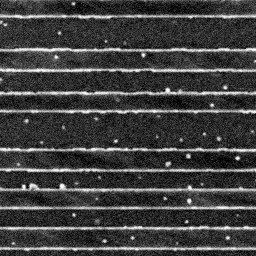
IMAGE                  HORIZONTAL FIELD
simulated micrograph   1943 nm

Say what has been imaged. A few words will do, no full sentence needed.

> lines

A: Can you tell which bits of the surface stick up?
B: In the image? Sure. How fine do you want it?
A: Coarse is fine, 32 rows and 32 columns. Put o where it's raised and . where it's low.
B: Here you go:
oooooooooooooooooooooooooooooooo
oooooooooooooooooooooooooooooooo
................................
................................
................................
................................
oooooooooooooooooooooooooooooooo
oooooooooooooooooooooooooooooooo
oooooooooooooooooooooooooooooooo
................................
................................
....................oo..........
oooooooooooooooooooooooooooooooo
oooooooooooooooooooooooooooooooo
................................
................................
................................
................................
................................
oooooooooooooooooooooooooooooooo
oooooooooooooooooooooooooooooooo
................................
................................
...oo..o........................
oooooooooooooooooooooooooooooooo
oooooooooooooooooooooooooooooooo
................................
................................
...............ooo.......o..o...
oooooooooooooooooooooooooooooooo
oooooooooooooooooooooooooooooooo
................................